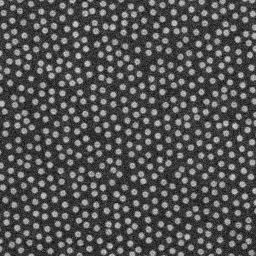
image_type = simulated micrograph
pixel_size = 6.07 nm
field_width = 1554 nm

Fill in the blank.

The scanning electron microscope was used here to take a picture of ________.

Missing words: a regular array of raised bodies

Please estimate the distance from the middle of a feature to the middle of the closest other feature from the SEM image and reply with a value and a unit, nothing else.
58.5 nanometers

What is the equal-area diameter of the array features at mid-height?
0.0329 um